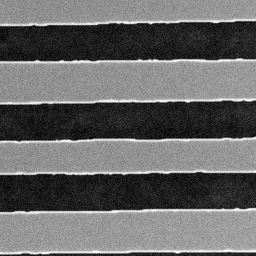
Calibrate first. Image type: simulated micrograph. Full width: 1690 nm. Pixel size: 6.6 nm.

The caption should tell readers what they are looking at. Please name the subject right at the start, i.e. lines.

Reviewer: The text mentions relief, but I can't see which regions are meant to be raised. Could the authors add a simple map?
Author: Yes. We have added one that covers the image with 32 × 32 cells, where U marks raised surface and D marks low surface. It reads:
UUUUUUUUUUUUUUUUUUUUUUUUUUUUUUUU
UUUUUUUUUUUUUUUUUUUUUUUUUUUUUUUU
UUUUUUUUUUUUUUUUUUUUUUUUUUUUUUUU
DDDDDDDDDDDDDDDDDDDDDDDDDDDDDDDD
DDDDDDDDDDDDDDDDDDDDDDDDDDDDDDDD
DDDDDDDDDDDDDDDDDDDDDDDDDDDDDDDD
DDDDDDDDDDDDDDDDDDDDDDDDDDDDDDDD
DDDDDDDDDDDDDDDDDDDDDDDDDDDDDUUD
UUUUUUUUUUUUUUUUUUUUUUUUUUUUUUUU
UUUUUUUUUUUUUUUUUUUUUUUUUUUUUUUU
UUUUUUUUUUUUUUUUUUUUUUUUUUUUUUUU
UUUUUUUUUUUUUUUUUUUUUUUUUUUUUUUU
UUUUUUUUUUUUUUUUUUUUUUUUUUUUDUUU
DDDDDDDDDDDDDDDDDDDDDDDDDDDDDDDD
DDDDDDDDDDDDDDDDDDDDDDDDDDDDDDDD
DDDDDDDDDDDDDDDDDDDDDDDDDDDDDDDD
DDDDDDDDDDDDDDDDDDDDDDDDDDDDDDDD
DDDDDDDDDDDUUUUUUDDDUUUUUUUUUUUU
UUUUUUUUUUUUUUUUUUUUUUUUUUUUUUUU
UUUUUUUUUUUUUUUUUUUUUUUUUUUUUUUU
UUUUUUUUUUUUUUUUUUUUUUUUUUUUUUUU
UUUUUUUUUUUUUUUUUUUUUUUUUUUUUUUU
DDDDDDDDDDDDDDDDDDDDDDDDDDDDDDDD
DDDDDDDDDDDDDDDDDDDDDDDDDDDDDDDD
DDDDDDDDDDDDDDDDDDDDDDDDDDDDDDDD
DDDDDDDDDDDDDDDDDDDDDDDDDDDDDDDD
DUUUUUUUUUUUUUUUUUUUUUUUUUUUUUUU
UUUUUUUUUUUUUUUUUUUUUUUUUUUUUUUU
UUUUUUUUUUUUUUUUUUUUUUUUUUUUUUUU
UUUUUUUUUUUUUUUUUUUUUUUUUUUUUUUU
UUUUUUUUUUUUUUUUUUUUUUUUUUUUUUUU
UUUUUUUUUUUUUUUUUDDDDUUDDDDDDDDD